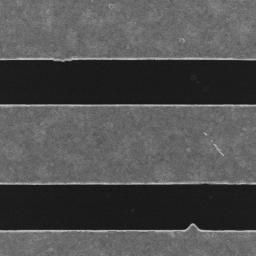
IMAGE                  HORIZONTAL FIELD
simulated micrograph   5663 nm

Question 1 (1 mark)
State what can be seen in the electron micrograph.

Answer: one or a few lines or trenches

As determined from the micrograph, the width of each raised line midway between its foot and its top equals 77.9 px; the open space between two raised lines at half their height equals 1040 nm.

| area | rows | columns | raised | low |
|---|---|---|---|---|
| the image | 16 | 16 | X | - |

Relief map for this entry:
XXXXXXXXXXXXXXXX
XXXXXXXXXXXXXXXX
XXXXXXXXXXXXXXXX
XXXXXXXXXXXXXXXX
----------------
----------------
----------------
XXXXXXXXXXXXXXXX
XXXXXXXXXXXXXXXX
XXXXXXXXXXXXXXXX
XXXXXXXXXXXXXXXX
----------------
----------------
----------------
XXXXXXXXXXXXXXXX
XXXXXXXXXXXXXXXX